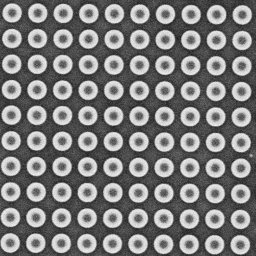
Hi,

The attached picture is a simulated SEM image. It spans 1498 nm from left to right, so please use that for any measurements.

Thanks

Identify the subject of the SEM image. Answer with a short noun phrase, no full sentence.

an array of small figures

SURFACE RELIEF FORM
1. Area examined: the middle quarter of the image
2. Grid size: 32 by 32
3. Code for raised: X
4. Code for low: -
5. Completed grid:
XX--XXXX--XXXXX--XXXX--XXXXX-XXX
XX--XXXX---XXX---XXXX--XXXX---XX
------------X-----XX----XX-----X
--------------------------------
X----XX----XX-----XX-----X-----X
XX--XXXX--XXXX---XXXX--XXXX---XX
XX--XXXX--XXXXX--XXXX--XXXX--XXX
XX--XXXX--XXXXX--XXXX--XXXX--XXX
X----XX----XXX---XXX----XXX---XX
--------------------------------
--------------------------------
XX--XXXX---XXX---XXXX--XXXX---XX
XX--XXXX--XXXXX--XXXX--XXXX--XXX
XX--XXXX--XXXXX--XXXX--XXXX--XXX
X---XXXX---XXX---XXXX--XXXX---XX
--------------------------------
--------------------------------
X----XX----XXX---XXX----XX----XX
XX--XXXX--XXXX---XXXX--XXXX--XXX
XX--XXXX--XXXXX-XXXXX--XXXX--XXX
XX--XXXX--XXXX---XXXX--XXXX--XXX
-----XX----XX-----XX----XX----XX
--------------------------------
-----XX-------------------------
XX--XXXX--XXXX---XXX---XXXX---XX
XX--XXXX--XXXX--XXXXX--XXXX--XXX
XX--XXXX--XXXX--XXXXX--XXXX--XXX
X---XXX----XXX---XXX---XXXX---XX
--------------------------------
--------------------------------
X---XXX----XXX---XXX---XXX----XX
XX--XXXX--XXXX--XXXXX--XXXX--XXX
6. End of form